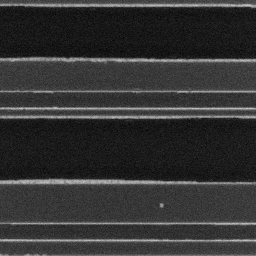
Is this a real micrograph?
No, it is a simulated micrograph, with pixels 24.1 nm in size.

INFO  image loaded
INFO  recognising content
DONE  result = lines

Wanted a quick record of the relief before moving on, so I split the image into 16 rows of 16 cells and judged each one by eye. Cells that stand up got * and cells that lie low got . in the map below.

................
................
................
................
****************
****************
****************
................
................
................
................
****************
****************
****************
****************
****************